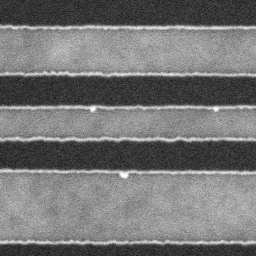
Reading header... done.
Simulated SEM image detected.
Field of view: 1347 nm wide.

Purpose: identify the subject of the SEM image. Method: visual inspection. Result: lines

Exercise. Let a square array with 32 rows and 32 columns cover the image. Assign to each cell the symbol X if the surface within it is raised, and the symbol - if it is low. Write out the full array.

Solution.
XXXXXXXXXXXXXXXXXXXXXXXXXXXXXXXX
XXXXXXXXXXXXXXXXXXXXXXXXXXXXXXXX
XXXXXXXXXXXXXXXXXXXXXXXXXXXXXXXX
--XXXXXXX-X-XXX-XXXXX--XXXXXXXXX
--------------------------------
--------------------------------
--------------------------------
--------------------------------
--------------------------------
XXXXXXXXXXXXXXXXXXXXXXXXXXXXXXXX
XXXXXXXXXXXXXXXXXXXXXXXXXXXXXXXX
XXXXXXXXXXXXXXXXXXXXXXXXXXXXXXXX
XXXXXXXXXXXXXXXXXXXXXXXXXXXXXXXX
-XX-X------X-XXXX-XX------X-----
--------------------------------
--------------------------------
--------------------------------
XXXXXXXXXXXXXXXXXXXXXXXXXXXXXXXX
XXXXXXXXXXXXXXXXXXXXXXXXXXXXXXXX
XXXXXXXXXXXXXXXXXXXXXXXXXXXXXXXX
XXXXXXXXXXXXXXXXXXXXXXXXXXXXXXXX
-------XXXXXXXXXXXXXXXXXXXXXXXXX
--------------------------------
--------------------------------
--------------------------------
--------------------------------
--------------------------------
--------------------------------
--------------------------------
--------------------------------
XXXXXXXXXXXXXXXXXXXXXXXXXXXXXXXX
XXXXXXXXXXXXXXXXXXXXXXXXXXXXXXXX